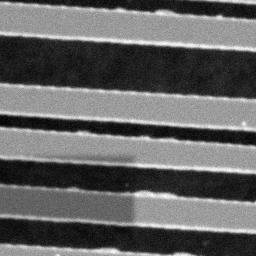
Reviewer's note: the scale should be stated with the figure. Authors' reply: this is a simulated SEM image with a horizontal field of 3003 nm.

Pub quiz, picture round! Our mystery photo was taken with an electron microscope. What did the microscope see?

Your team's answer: lines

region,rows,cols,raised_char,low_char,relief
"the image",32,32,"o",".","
ooo.............................
oooooooooooooooooo..............
ooooooooooooooooooooooooooooooo.
oooooooooooooooooooooooooooooooo
...ooooooooooooooooooooooooooooo
....................oooooooooooo
................................
................................
................................
................................
................................
ooooooooooooooo.................
ooooooooooooooooooooooooooooooo.
oooooooooooooooooooooooooooooooo
.....ooooooooooooooooooooooooooo
...................ooooooooooooo
ooooooo.........................
ooooooooooooooooooooo...........
oooooooooooooooooooooooooooooooo
oooooooooooooooooooooooooooooooo
...........ooooooooooooooooooooo
..............................oo
................................
oooooo..........................
oooooooooooooooooooo............
oooooooooooooooooooooooooooooooo
oooooooooooooooooooooooooooooooo
.....ooooooooooooooooooooooooooo
.....................ooooooooooo
................................
................................
ooooooooooooooo.................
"